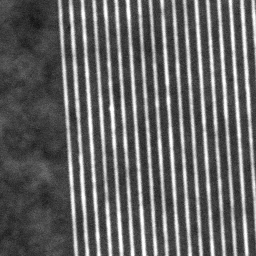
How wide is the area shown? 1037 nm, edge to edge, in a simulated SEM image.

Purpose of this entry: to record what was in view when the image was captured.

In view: parallel lines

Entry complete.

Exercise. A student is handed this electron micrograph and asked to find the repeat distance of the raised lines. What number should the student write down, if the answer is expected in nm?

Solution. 46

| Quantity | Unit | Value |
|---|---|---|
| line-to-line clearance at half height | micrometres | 0.0379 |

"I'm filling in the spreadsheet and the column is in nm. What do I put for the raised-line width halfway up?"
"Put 10.1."